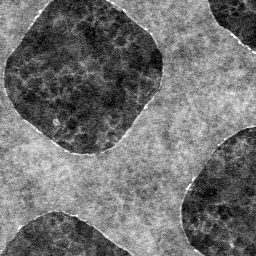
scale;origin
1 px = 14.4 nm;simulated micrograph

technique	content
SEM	raised bodies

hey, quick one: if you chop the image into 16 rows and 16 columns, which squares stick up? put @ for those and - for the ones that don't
---@@@@------@@@
--@@@@@@@-----@@
-@@@@@@@@@-----@
-@@@@@@@@@------
@@@@@@@@@@------
@@@@@@@@@@------
-@@@@@@@@-------
--@@@@@@@-------
---@@@@@------@@
----@@-------@@@
-------------@@@
------------@@@@
-----------@@@@@
---@@------@@@@@
-@@@@@------@@@@
@@@@@@@@----@@@@